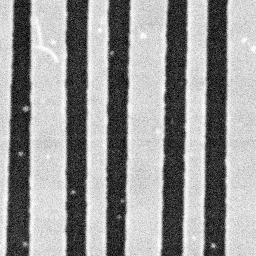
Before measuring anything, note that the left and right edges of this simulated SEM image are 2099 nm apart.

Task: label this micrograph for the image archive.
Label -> lines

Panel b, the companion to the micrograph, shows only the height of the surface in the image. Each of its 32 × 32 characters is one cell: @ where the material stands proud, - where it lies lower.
@@--@@@@---@@---@@@@@---@@--@@@@
@@--@@@@---@@---@@@@@---@@--@@@@
@@--@@@@---@@---@@@@@---@@--@@@@
@@--@@@@---@@---@@@@@---@@--@@@@
@---@@@@---@@---@@@@@---@@--@@@@
@---@@@@---@@---@@@@@---@@--@@@@
@---@@@@---@@---@@@@@---@@--@@@@
@---@@@@---@@---@@@@@---@@--@@@@
@---@@@@---@@---@@@@@--@@@--@@@@
@---@@@@---@@---@@@@@--@@@--@@@@
@---@@@@---@@---@@@@@--@@@--@@@@
@---@@@@---@@---@@@@@--@@@--@@@@
@---@@@@---@@---@@@@---@@@--@@@@
@---@@@@---@@---@@@@@--@@@--@@@@
@---@@@@---@@---@@@@---@@@--@@@@
@---@@@@---@@---@@@@---@@@--@@@@
@---@@@@---@@---@@@@---@@@--@@@@
@---@@@@---@@---@@@@---@@@--@@@@
@---@@@@---@@---@@@@---@@@--@@@@
@---@@@@---@@---@@@@---@@@--@@@@
@---@@@@---@@---@@@@---@@---@@@@
@---@@@@---@@---@@@@---@@@--@@@@
@---@@@@---@@---@@@@---@@@--@@@@
@---@@@@---@@---@@@@---@@@--@@@@
@---@@@@---@@---@@@@---@@@--@@@@
@---@@@@---@@---@@@@---@@---@@@@
@---@@@@---@@---@@@@---@@---@@@@
@---@@@@---@@---@@@@---@@---@@@@
@---@@@@---@@---@@@@---@@---@@@@
@---@@@@---@@---@@@@---@@---@@@@
@---@@@@---@@---@@@@---@@---@@@@
@---@@@@---@@---@@@@---@@---@@@@